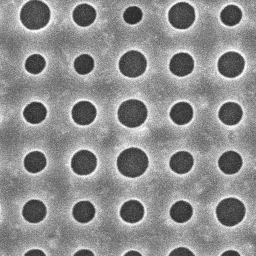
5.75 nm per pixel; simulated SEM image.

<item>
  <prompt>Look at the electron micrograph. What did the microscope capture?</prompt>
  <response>a regular array of holes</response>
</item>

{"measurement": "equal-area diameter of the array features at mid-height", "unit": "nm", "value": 143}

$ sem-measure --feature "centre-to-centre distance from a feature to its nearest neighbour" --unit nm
280